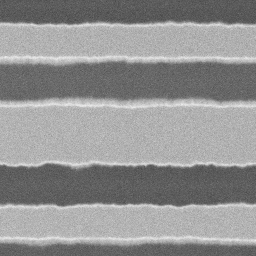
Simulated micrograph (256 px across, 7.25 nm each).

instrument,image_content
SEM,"lines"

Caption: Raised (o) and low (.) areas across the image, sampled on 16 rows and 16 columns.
................
................
oooooooooooooooo
oooooooooooooooo
................
................
...oo......o....
oooooooooooooooo
oooooooooooooooo
oooooooooooooooo
................
................
................
oooooooooooooooo
oooooooooooooooo
................